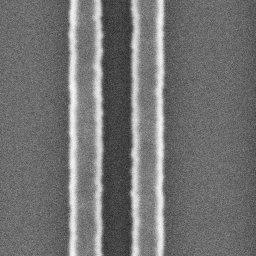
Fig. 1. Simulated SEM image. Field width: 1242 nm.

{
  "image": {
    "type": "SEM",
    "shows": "lines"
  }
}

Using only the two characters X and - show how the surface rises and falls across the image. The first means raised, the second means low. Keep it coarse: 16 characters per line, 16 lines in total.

----XX--XX------
----XX--XX------
----XX--XX------
----XX--XX------
----XX--XX------
----XX--XX------
----XX--XX------
----XX--XX------
----XX--XX------
----XX--XX------
----XX--XX------
----XX--XX------
----XX--XX------
----XX--XX------
----XX--XX------
----XX--XX------